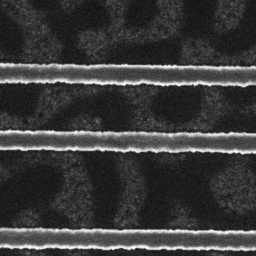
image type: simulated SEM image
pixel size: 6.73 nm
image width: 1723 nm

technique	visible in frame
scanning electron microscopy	lines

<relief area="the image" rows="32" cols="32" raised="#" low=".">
................................
................................
................................
................................
................................
................................
................................
................................
##############################.#
################################
...................#####..#####.
................................
................................
................................
................................
................................
.##.............................
################################
################################
................................
................................
................................
................................
................................
................................
................................
................................
................................
................................
################################
################################
................................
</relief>